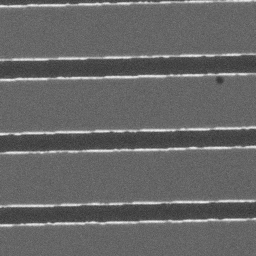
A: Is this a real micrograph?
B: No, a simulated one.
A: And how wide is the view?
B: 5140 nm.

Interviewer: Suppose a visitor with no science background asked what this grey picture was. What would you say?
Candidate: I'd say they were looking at lines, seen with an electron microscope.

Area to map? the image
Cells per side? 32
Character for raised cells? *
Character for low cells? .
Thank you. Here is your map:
...............*****************
********************************
********************************
********************************
********************************
********************************
********************************
................................
................................
.................***************
********************************
********************************
********************************
********************************
********************************
********************************
***********.....................
................................
........................*.******
********************************
********************************
********************************
********************************
********************************
********************************
**************..................
................................
..........................*..***
********************************
********************************
********************************
********************************